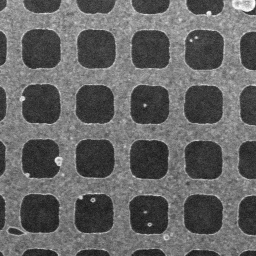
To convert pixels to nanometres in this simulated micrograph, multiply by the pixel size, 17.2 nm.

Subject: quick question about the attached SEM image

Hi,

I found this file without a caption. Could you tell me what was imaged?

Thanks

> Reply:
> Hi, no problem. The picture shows a regular array of holes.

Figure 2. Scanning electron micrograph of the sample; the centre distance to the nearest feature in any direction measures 0.931 um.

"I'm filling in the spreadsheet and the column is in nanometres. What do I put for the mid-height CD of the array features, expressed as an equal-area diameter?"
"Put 728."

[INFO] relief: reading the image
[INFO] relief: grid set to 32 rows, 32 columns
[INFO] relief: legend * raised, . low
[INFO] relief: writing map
.**.....**....**.....**.....****
****...***....***....***....***.
********************************
********************************
.**....***....***....**.....**..
.**.....**....**.....**.....**..
.**.....**.....*.....**.....**..
.**.....**....**.....**.....**..
****...****..****...****...****.
********************************
****..**************************
.**....***....**.....**.....**..
.**.....*.....**.....**.....**..
.**.....*.....**.....**.....**..
.**....***....**.....**.....**..
****..*****..*****..*****.*****.
********************************
****...***...****...************
.**....**.....**.....**.....**..
.**....**.....**.....**.....**..
.**....**.....**.....**.....**..
.**....***....**.....**.....**..
********************************
********************************
***....***....***...****...****.
.**....**.....**.....**.....**..
.*.....**.....**.....**.....**..
.**....**.....**.....**.....**..
***....***....**.....**.....**..
********************************
********************************
***....***...****...****...***..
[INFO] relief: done